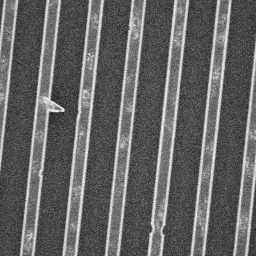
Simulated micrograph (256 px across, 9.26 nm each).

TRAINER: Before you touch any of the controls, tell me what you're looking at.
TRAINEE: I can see parallel lines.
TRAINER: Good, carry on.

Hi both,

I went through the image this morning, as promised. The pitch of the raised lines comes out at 392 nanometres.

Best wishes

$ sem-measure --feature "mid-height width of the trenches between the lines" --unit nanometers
278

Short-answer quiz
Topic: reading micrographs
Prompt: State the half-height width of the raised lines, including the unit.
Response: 113 nm